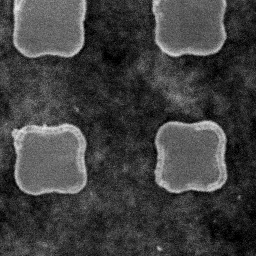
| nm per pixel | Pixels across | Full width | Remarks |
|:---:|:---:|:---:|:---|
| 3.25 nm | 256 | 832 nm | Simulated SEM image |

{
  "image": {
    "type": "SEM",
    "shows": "raised bodies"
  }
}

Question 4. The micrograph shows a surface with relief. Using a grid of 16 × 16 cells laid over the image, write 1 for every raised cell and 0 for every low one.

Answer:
0111100000111100
0111100000111100
0111100000111100
0010000000000000
0000000000000000
0000000000000000
0000000000000000
0000000000000000
0111100000111100
0111100000111100
0111100000111100
0111100000111100
0000000000000000
0000000000000000
0000000000000000
0000000000000000